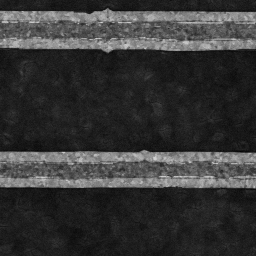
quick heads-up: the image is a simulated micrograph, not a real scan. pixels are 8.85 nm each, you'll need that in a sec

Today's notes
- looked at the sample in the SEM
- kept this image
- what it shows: one or a few lines or trenches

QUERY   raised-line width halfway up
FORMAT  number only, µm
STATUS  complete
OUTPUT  0.229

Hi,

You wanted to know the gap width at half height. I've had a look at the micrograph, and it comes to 1000 nanometres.